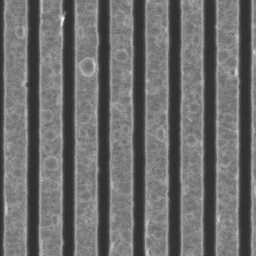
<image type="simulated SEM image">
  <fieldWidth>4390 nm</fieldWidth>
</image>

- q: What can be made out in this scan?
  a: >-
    parallel lines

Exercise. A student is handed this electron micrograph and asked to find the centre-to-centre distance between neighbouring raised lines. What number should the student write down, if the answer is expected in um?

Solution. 0.606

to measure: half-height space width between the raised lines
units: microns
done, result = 0.197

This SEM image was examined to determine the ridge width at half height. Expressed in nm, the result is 409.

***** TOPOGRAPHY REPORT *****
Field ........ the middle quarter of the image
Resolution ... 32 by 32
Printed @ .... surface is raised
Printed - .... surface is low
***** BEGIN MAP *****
---@@@@@@--@@@@@@---@@@@@@---@@@
---@@@@@@--@@@@@@---@@@@@@---@@@
---@@@@@---@@@@@@---@@@@@@---@@@
---@@@@@---@@@@@@---@@@@@@---@@@
---@@@@@---@@@@@@---@@@@@@---@@@
---@@@@@@--@@@@@@---@@@@@@---@@@
---@@@@@@--@@@@@@---@@@@@@---@@@
---@@@@@---@@@@@@---@@@@@@---@@@
---@@@@@---@@@@@@---@@@@@@---@@@
---@@@@@---@@@@@@---@@@@@@---@@@
---@@@@@---@@@@@@---@@@@@@---@@@
---@@@@@---@@@@@@---@@@@@@---@@@
---@@@@@---@@@@@@---@@@@@@---@@@
---@@@@@---@@@@@@---@@@@@@---@@@
---@@@@@---@@@@@@---@@@@@@---@@@
---@@@@@---@@@@@@---@@@@@@---@@@
---@@@@@---@@@@@@---@@@@@@---@@@
---@@@@@---@@@@@@---@@@@@@---@@@
---@@@@@---@@@@@@---@@@@@@---@@@
---@@@@@---@@@@@@---@@@@@@---@@@
---@@@@@---@@@@@@---@@@@@@---@@@
---@@@@@---@@@@@@---@@@@@@---@@@
---@@@@@---@@@@@@---@@@@@@---@@@
---@@@@@---@@@@@@---@@@@@@---@@@
---@@@@@---@@@@@@---@@@@@@---@@@
---@@@@@@--@@@@@@---@@@@@@---@@@
---@@@@@@--@@@@@@---@@@@@@---@@@
---@@@@@---@@@@@@---@@@@@@---@@@
---@@@@@---@@@@@@---@@@@@@---@@@
---@@@@@---@@@@@@---@@@@@@---@@@
---@@@@@---@@@@@@---@@@@@@---@@@
---@@@@@---@@@@@@---@@@@@@---@@@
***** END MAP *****